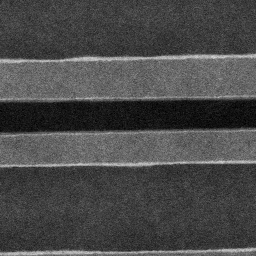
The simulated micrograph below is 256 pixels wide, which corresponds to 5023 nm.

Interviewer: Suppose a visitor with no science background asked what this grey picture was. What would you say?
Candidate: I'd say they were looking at lines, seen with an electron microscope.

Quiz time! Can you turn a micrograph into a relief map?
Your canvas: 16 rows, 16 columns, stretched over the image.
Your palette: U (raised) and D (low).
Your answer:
DDDDDDDDDDDDDDDD
DDDDDDDDDDDDDDDD
DDDDDDDDDDDDDDDD
DDDDDDDDDDDDDDDD
UUUUUUUUUUUUUUUU
UUUUUUUUUUUUUUUU
DDDDDDDDDDDDDDDD
DDDDDDDDDDDDDDDD
UUUUUUUUUUUUUUUU
UUUUUUUUUUUUUUUU
DDDDDDDDDDDDDDDD
DDDDDDDDDDDDDDDD
DDDDDDDDDDDDDDDD
DDDDDDDDDDDDDDDD
DDDDDDDDDDDDDDDD
DDDDDDDDDDDDDDDD